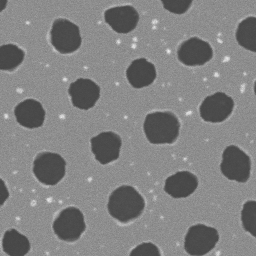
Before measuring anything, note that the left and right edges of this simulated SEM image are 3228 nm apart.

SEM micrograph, a regular array of holes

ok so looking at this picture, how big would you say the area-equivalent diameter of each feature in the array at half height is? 31.7 px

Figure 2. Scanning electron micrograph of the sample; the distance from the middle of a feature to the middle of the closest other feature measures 733 nm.